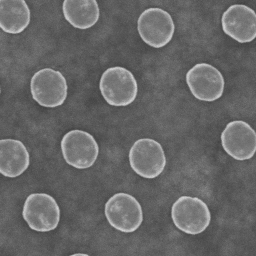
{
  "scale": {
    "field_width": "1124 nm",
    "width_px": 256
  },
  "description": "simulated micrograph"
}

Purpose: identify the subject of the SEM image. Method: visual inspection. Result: a regular array of raised bodies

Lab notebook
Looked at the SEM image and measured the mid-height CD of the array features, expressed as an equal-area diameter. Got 0.161 µm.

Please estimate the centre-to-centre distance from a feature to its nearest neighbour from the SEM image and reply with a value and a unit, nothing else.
302 nanometers